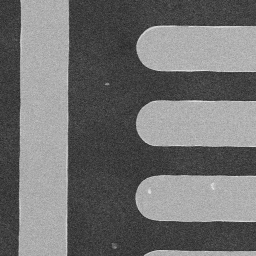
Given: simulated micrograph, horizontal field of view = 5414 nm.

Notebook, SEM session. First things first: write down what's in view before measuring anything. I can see groups of lines, slits or small figures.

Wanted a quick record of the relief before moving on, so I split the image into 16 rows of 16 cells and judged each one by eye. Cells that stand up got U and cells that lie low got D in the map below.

DUUUDDDDDDDDDDDD
DUUUDDDDDDDDDDDD
DUUUDDDDDUUUUUUU
DUUUDDDDDUUUUUUU
DUUUDDDDDDDDDDDD
DUUUDDDDDDDDDDDD
DUUUDDDDDUUUUUUU
DUUUDDDDDUUUUUUU
DUUUDDDDDUUUUUUU
DUUUDDDDDDDDDDDD
DUUUDDDDDDDDDDDD
DUUUDDDDDUUUUUUU
DUUUDDDDDUUUUUUU
DUUUDDDDDUUUUUUU
DUUUDDDDDDDDDDDD
DUUUDDDDDDDDDDDD